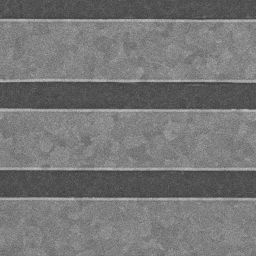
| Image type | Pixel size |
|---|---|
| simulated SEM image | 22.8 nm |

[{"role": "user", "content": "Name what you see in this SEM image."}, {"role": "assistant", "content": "one or a few lines or trenches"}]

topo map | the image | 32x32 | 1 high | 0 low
00000000000000000000000000000000
00000000000000000000000000000000
00000000000000000000000000000000
11111111111111111111111111111111
11111111111111111111111111111111
11111111111111111111111111111111
11111111111111111111111111111111
11111111111111111111111111111111
11111111111111111111111111111111
11111111111111111111111111111111
00000000000000000000000000000000
00000000000000000000000000000000
00000000000000000000000000000000
00000000000000000000000000000000
11111111111111111111111111111111
11111111111111111111111111111111
11111111111111111111111111111111
11111111111111111111111111111111
11111111111111111111111111111111
11111111111111111111111111111111
11111111111111111111111111111111
00000000000000000000000000000000
00000000000000000000000000000000
00000000000000000000000000000000
00000000000000000000000000000000
11111111111111111111111111111111
11111111111111111111111111111111
11111111111111111111111111111111
11111111111111111111111111111111
11111111111111111111111111111111
11111111111111111111111111111111
11111111111111111111111111111111